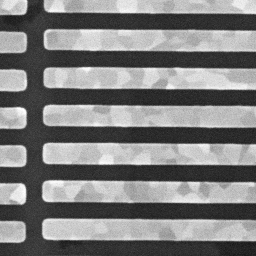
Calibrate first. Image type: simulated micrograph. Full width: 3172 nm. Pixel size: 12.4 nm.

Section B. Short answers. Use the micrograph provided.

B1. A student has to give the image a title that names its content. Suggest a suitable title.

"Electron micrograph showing wiring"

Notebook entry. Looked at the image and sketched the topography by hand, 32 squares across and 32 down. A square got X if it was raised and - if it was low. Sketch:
XXX---XXXXXXXXXXXXXXXXXXXXXXXXXX
XXX-----XXXXXXXXXXXXXXXXXXXXXXXX
--------------------------------
--------------------------------
XXX---XXXXXXXXXXXXXXXXXXXXXXXXXX
XXX---XXXXXXXXXXXXXXXXXXXXXXXXXX
XXX-----------------------------
--------------------------------
--------------------------------
XXX---XXXXXXXXXXXXXXXXXXXXXXXXXX
XXX---XXXXXXXXXXXXXXXXXXXXXXXXXX
--------------------------------
--------------------------------
XXX---XXXXXXXXXXXXXXXXXXXXXXXXXX
XXX--XXXXXXXXXXXXXXXXXXXXXXXXXXX
XXX---XXXXXXXXXXXXXXXXXXXXXXXXXX
--------------------------------
--------------------------------
XXX--XXXXXXXXXXXXXXXXXXXXXXXXXXX
XXX--XXXXXXXXXXXXXXXXXXXXXXXXXXX
XXX-------------XXXXXXXXXXXXXXXX
--------------------------------
--------------------------------
XXX--XXXXXXXXXXXXXXXXXXXXXXXXXXX
XXX--XXXXXXXXXXXXXXXXXXXXXXXXXXX
XXX-----------------------------
--------------------------------
------XXXXXXXXXXXX--------------
XXX--XXXXXXXXXXXXXXXXXXXXXXXXXXX
XXX--XXXXXXXXXXXXXXXXXXXXXXXXXXX
--------------------------------
--------------------------------